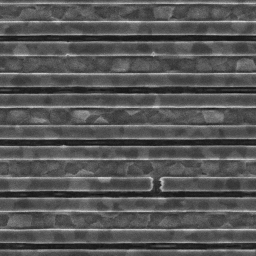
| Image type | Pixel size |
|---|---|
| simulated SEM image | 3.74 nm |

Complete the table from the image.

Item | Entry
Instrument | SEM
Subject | parallel lines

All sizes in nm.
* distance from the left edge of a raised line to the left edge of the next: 97.2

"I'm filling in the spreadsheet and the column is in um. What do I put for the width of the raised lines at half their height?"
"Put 0.0523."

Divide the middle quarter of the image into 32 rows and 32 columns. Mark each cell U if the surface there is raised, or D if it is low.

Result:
DDDDDDDDDDDDDDDDDDDDDDDDDDDDDDDD
DDDDDDDDDDDDDDDDDDDDDDDDDDDDDDDD
DDDDDDDDDDDDDDDDDDDDDDDDDDDDDDDD
UUUUUUUUUUUUUUUUUUUUUUUUUUUUUUUU
UUUUUUUUUUUUUUUUUUUUUUUUUUUUUUUU
UUUUUUUUUUUUUUUUUUUUUUUUUUUUUUUU
DDDDDDDDDDDDDDDDDDDDDDDDDDDDDDDD
DDDDDDDDDDDDDDDDDDDDDDDDDDDDDDDD
UUUUUUUUUUUUUUUUUUUUUUUUUUUUUUUU
UUUUUUUUUUUUUUUUUUUUUUUUUUUUUUUU
UUUUUUUUUUUUUUUUUUUUUUUUUUUUUUUU
DDDDDDDDDDDDDDDDDDDDDDDDDDDDDDDD
DDDDDDDDDDDDDDDDDDDDDDDDDDDDDDDD
DDDDDDDDDDDDDDDDDDDDDDDDDDDDDDDD
DDDDDDDDDDDDDDDDDDDDDDDDDDDDDDDD
DDDDDDDDDDDDDUUDDDDDDDDDDDDDDDDD
UUUUUUUUUUUUUUUUUUUUUUUUUUUUUUUU
UUUUUUUUUUUUUUUUUUUUUUUUUUUUUUUU
UUUUUUUUUUUUUUUUUUUUUUUUUUUUUUUU
DDDDDDDDDDDDDDDDDDDDDDDDDDDDDDDD
DDDDDDDDDDDDDDDDDDDDDDDDDDDDDDDD
UUUUUUUUUUUUUUUUUUUUUUUUUUUUUUUU
UUUUUUUUUUUUUUUUUUUUUUUUUUUUUUUU
UUUUUUUUUUUUUUUUUUUUUUUUUUUUUUUU
DDDDDDDDDDDDDDDDDDDDDDDDDDDDDDDD
DDDDDDDDDDDDDDDDDDDDDDDDDDDDDDDD
DDDDDDDDDDDDDDDDDDDDDDDDDDDDDDDD
DDDDDDDDDDDDDDDDDDDDDDDDDDDDDDDD
DDDDDDDDDDDDDDDDDDDDDDDDDDDDDDDD
UUUUUUUUUUUUUUUUUUUUUUDDUUUUUUUU
UUUUUUUUUUUUUUUUUUUUUUDDUUUUUUUU
UUUUUUUUUUUUUUUUUUUUUUDDUUUUUUUU